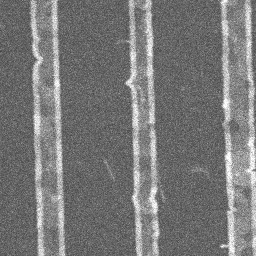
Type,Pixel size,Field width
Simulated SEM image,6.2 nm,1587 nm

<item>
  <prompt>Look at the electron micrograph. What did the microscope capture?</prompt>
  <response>one or a few lines or trenches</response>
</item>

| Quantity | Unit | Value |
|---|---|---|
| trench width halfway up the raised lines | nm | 470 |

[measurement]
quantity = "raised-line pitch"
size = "595 nm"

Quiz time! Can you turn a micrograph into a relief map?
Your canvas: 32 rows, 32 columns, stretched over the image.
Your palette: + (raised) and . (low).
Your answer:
....+++.........+++.........+++.
....+++.........+++.........+++.
....+++..........++.........+++.
....+++..........++.........+++.
....+++..........++.........+++.
....+++.........+++.........+++.
....+++..........++.........+++.
.....++..........++.........+++.
.....++..........++.........+++.
....+++..........++.........+++.
....+++.........+++.........+++.
.....++..........++.........++++
.....++..........++.........+++.
.....++..........++.........+++.
.....++..........++.........+++.
.....++..........++.........+++.
.....++..........++.........+++.
.....++..........++.........+++.
.....++..........++.........++++
.....++..........++..........+++
.....++..........++..........+++
.....++..........++..........++.
.....++..........++..........+++
.....++..........++..........+++
.....+++.........++..........+++
.....+++.........++..........+++
.....+++.........++..........+++
.....+++.........++..........+++
.....+++.........+++.........+++
.....+++.........++..........+++
.....+++.........++..........+++
.....+++.........+++.........+++